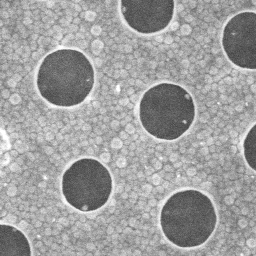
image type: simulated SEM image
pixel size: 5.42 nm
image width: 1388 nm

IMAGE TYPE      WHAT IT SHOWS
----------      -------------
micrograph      holes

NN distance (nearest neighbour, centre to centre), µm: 0.579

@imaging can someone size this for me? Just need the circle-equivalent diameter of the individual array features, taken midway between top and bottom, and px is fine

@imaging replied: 56.8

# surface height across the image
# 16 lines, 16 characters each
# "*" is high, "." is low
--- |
********...*****
********...***..
**************..
***..*********..
**....**********
**....***..*****
***..****...****
*********...****
**********.****.
***************.
****...*********
****...*********
****...***...***
**********....**
.*********...***
..**************